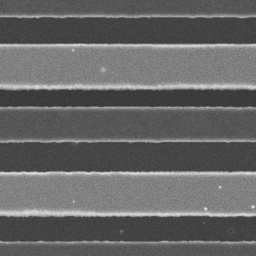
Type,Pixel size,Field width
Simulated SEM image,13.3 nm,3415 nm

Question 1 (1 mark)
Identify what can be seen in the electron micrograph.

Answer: lines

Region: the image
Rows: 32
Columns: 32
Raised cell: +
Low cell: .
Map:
++++++++++++++++++++++++++++++++
++++++++++++++++++++++++++++++++
................................
................................
................................
................................
++++++++++++++++++++++++++++++++
++++++++++++++++++++++++++++++++
++++++++++++++++++++++++++++++++
++++++++++++++++++++++++++++++++
++++++++++++++++++++++++++++++++
................................
................................
++++++++++++++++++++++++++++++++
++++++++++++++++++++++++++++++++
++++++++++++++++++++++++++++++++
++++++++++++++++++++++++++++++++
++++++++++++++++++++++++++++++++
................................
................................
................................
.........+.+...+..............+.
++++++++++++++++++++++++++++++++
++++++++++++++++++++++++++++++++
++++++++++++++++++++++++++++++++
++++++++++++++++++++++++++++++++
++++++++++++++++++++++++++++++++
................................
................................
................................
++++++++++++++++++++++++++++++++
++++++++++++++++++++++++++++++++